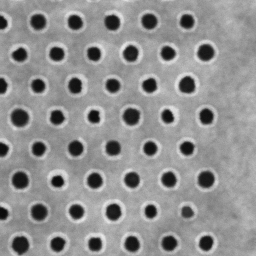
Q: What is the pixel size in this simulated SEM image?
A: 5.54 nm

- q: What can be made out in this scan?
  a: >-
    a regular array of holes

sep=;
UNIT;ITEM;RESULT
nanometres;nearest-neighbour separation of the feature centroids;201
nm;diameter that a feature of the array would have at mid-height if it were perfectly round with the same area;80.7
